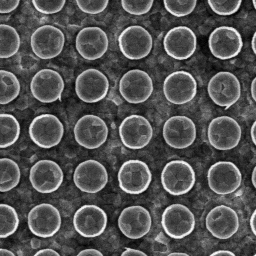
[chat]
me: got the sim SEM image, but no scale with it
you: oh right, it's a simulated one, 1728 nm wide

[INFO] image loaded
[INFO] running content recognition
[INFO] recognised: a regular array of raised bodies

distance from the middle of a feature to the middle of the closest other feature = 296 nm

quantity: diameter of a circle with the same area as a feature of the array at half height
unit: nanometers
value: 224